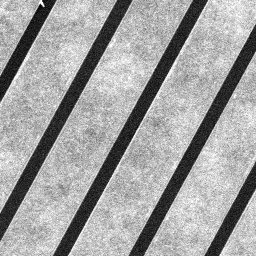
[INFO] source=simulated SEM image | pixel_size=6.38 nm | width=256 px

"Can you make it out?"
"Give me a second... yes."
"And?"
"one or a few lines or trenches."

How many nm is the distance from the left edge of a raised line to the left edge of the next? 424